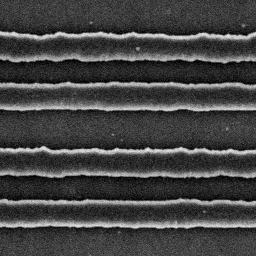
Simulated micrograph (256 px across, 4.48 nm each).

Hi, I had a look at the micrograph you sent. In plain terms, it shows lines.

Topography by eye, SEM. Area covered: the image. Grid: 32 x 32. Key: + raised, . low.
................................
................................
................................
................................
++++..+++++++++++++++...+++.+..+
++++++++++++++++++++++++++++++++
++++++++++++++++++++++++++++++++
.+++......................++++..
................................
................................
........+...++++++.+.+......+...
++++++++++++++++++++++++++++++++
++++++++++++++++++++++++++++++++
++++........++++++++++.+++++++++
................................
................................
................................
................................
.....+..........................
++++++++++++++++++++++++++++++++
++++++++++++++++++++++++++++++++
++++++++++++++++++++++++++++++++
................................
................................
................................
++++++++++++++++++++++++++++++++
++++++++++++++++++++++++++++++++
++++++++++++++++++++++++++++++++
................................
................................
................................
................................